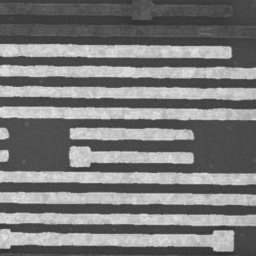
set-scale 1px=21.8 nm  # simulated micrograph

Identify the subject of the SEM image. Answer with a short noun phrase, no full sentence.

wiring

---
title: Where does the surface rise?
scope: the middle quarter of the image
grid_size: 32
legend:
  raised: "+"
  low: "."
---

................................
++++++++++++++++++++++++++++++++
++++++++++++++++++++++++++++++++
................................
................................
................................
++++++++++++++++++++++++++++++++
++++++++++++++++++++++++++++++++
.......................+++++++++
................................
................................
++++++++++++++++++++++++++++++++
++++++++++++++++++++++++++++++++
.........+++...++++.++++++++++++
................................
................................
..++++++++++++++++++++++++......
..++++++++++++++++++++++++++++++
..++++++++++++++++++++++++++++++
................................
................................
..+++++.........................
..++++++++++++++++++++++++++++++
..++++++++++++++++++++++++++++++
..+++++.++++++.+++++++++++++++++
..++++..........................
................................
++++++++++++++++++++++.+++++....
++++++++++++++++++++++++++++++++
.........+++++++++++++++++++++++
................................
................................